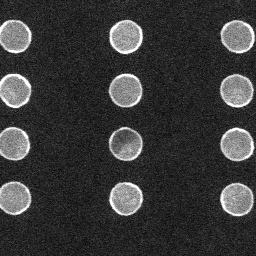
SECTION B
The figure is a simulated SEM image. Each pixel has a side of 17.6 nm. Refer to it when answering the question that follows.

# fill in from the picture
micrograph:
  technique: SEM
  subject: a regular array of raised bodies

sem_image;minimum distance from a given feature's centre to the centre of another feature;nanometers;948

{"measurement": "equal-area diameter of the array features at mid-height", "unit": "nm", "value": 571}